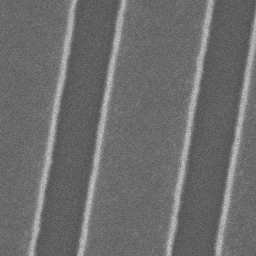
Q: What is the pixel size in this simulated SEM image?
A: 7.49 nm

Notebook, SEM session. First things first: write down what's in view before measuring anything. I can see one or a few lines or trenches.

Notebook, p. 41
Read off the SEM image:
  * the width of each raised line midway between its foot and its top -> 646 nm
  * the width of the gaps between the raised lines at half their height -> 361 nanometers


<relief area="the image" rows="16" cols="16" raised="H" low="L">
HHHHHLLLHHHHHLLL
HHHHLLLHHHHHHLLL
HHHHLLLHHHHHHLLL
HHHHLLLHHHHHHLLL
HHHHLLLHHHHHLLLL
HHHHLLLHHHHHLLLH
HHHHLLLHHHHHLLLH
HHHLLLHHHHHHLLLH
HHHLLLHHHHHHLLLH
HHHLLLHHHHHHLLLH
HHHLLLHHHHHLLLLH
HHHLLLHHHHHLLLHH
HHHLLLHHHHHLLLHH
HHLLLHHHHHHLLLHH
HHLLLHHHHHHLLLHH
HHLLLHHHHHHLLLHH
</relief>